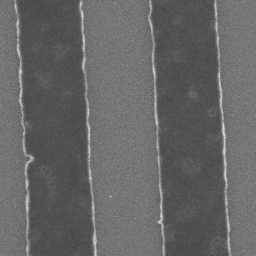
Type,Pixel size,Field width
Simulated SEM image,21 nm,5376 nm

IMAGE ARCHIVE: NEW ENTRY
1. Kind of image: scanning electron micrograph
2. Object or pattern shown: one or a few lines or trenches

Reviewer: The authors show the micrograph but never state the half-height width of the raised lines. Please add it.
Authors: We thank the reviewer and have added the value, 1390 nm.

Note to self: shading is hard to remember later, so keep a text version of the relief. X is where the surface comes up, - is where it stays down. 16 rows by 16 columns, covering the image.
-XXXX----XXXXX--
-XXXX----XXXXX--
-XXXX-----XXXX--
-XXXX-----XXXX--
-XXXX-----XXXX--
-XXXX-----XXXX--
-XXXX-----XXXX--
-XXXX-----XXXX--
-XXXXX----XXXX--
--XXXX----XXXX--
--XXXX----XXXX--
--XXXX----XXXX--
--XXXX----XXXX--
--XXXX----XXXX--
--XXXX----XXXX--
--XXXX----XXXX--